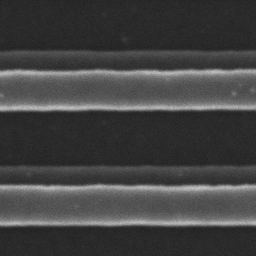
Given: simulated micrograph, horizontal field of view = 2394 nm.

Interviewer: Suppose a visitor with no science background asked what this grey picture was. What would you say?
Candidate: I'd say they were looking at lines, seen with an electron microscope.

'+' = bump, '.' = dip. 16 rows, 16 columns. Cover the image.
................
................
................
.+.+++++++++++++
++++++++++++++++
++++++++++++++++
++++++++++++++++
................
................
................
..++..+.++++++++
++++++++++++++++
++++++++++++++++
++++++++++++++++
................
................